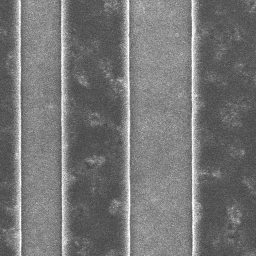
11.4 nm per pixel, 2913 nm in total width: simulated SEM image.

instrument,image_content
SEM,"one or a few lines or trenches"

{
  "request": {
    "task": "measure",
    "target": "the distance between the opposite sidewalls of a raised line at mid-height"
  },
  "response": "67.2 px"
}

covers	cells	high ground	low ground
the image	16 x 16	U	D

UDDDUUUUDDDDUUUU
UDDDUUUUDDDDUUUU
UDDDUUUUDDDDUUUU
UDDDUUUUDDDDUUUU
UDDDUUUUDDDDUUUU
UDDDUUUUDDDDUUUU
UDDDUUUUDDDDUUUU
UDDDUUUUDDDDUUUU
UDDDUUUUDDDDUUUU
UDDDUUUUDDDDUUUU
UDDDUUUUDDDDUUUU
UDDDUUUUDDDDUUUU
UDDDUUUUDDDDUUUU
UDDDUUUUDDDDUUUU
UDDDUUUUDDDDUUUU
UDDDUUUUDDDDUUUU